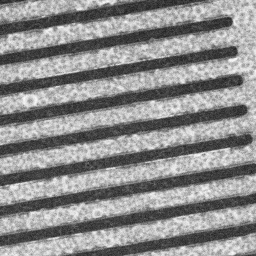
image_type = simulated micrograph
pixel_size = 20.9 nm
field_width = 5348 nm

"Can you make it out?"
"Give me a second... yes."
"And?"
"parallel lines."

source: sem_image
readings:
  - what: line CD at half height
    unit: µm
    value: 0.245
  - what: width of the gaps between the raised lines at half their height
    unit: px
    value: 18.2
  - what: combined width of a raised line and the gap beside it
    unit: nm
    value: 621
